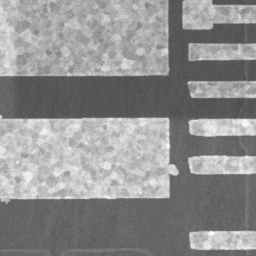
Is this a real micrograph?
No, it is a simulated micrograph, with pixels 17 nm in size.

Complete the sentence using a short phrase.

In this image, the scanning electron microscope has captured wiring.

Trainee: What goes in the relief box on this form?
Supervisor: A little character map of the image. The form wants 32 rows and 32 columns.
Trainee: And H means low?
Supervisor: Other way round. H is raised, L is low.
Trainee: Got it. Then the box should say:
HHHHHHHHHHHHHHHHHHHHHLLHHHLLLLLH
HHHHHHHHHHHHHHHHHHHHHLLHHHHHHHHH
HHHHHHHHHHHHHHHHHHHHHLLHHHHHHHHH
HHHHHHHHHHHHHHHHHHHHHLLLLLLLLLLH
HHHHHHHHHHHHHHHHHHHHHLLLLLLLLLLH
HHHHHHHHHHHHHHHHHHHHHLLLHLLLLLHH
HHHHHHHHHHHHHHHHHHHHHLLLHHHHHHHH
HHHHHHHHHHHHHHHHHHHHHLLLLLLLLLHH
HHHHHHHHHHHHHHHHHHHHHLLLLLLLLLLH
LLLLLLLLLLLLLLLLLLLLLLLLLLLLLLLH
LLLLLLLLLLLLLLLLLLLLLLLLHHHHHHHH
LLLLLLLLLLLLLLLLLLLLLLLLHHHHHHHH
LLLLLLLLLLLLLLLLLLLLLLLLLLLLLLLH
LLLLLLLLLLLLLLLLLLLLLLLLLLLLLLHH
LLLLLLLLLLLLLLLLLLLLLLLLLLLLLLHH
HHHHHHHHHHHHHHHHHHHHHLLLHHHHHHHH
HHHHHHHHHHHHHHHHHHHHHLLLHHHHHHHH
HHHHHHHHHHHHHHHHHHHHHLLLLLLLLLHH
HHHHHHHHHHHHHHHHHHHHHLLLLLLLLLHH
HHHHHHHHHHHHHHHHHHHHHLLLLLLLLLHH
HHHHHHHHHHHHHHHHHHHHHLLLHHHHHHHH
HHHHHHHHHHHHHHHHHHHHHHLLHHHLLHHH
HHHHHHHHHHHHHHHHHHHHHLLLLLLLLLLH
HHHHHHHHHHHHHHHHHHHHHLLLLLLLLLLH
HHHHHHHHHHHHHHHHHHHHHLLLLLLLLLLH
LLLLLLLLLLLLLLLLLLLLLLLLLLLLLLLH
LLLLLLLLLLLLLLLLLLLLLLLLLLLLLLLH
LLLLLLLLLLLLLLLLLLLLLLLLLLLLLLLH
LLLLLLLLLLLLLLLLLLLLLLLLLLLLLLLH
LLLLLLLLLLLLLLLLLLLLLLLLHHHHHHHH
LLLLLLLLLLLLLLLLLLLLLLLLHHHHHHHH
HHHHHLLLHHHHHHHHHHLLLLLLLLLLLLLH